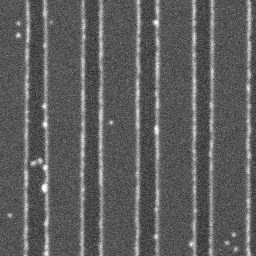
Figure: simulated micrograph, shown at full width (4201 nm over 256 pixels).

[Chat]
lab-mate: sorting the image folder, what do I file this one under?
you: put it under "lines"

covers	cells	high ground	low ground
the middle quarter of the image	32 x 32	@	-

@@@@@----@@@@@@@@@@----@@@@@@@@@
@@@@@----@@@@@@@@@@----@@@@@@@@@
@@@@@----@@@@@@@@@@----@@@@@@@@@
@@@@@----@@@@@@@@@-----@@@@@@@@@
@@@@@----@@@@@@@@@-----@@@@@@@@@
@@@@@----@@@@@@@@@-----@@@@@@@@@
@@@@@----@@@@@@@@@-----@@@@@@@@@
@@@@@----@@@@@@@@@-----@@@@@@@@@
@@@@@----@@@@@@@@@-----@@@@@@@@@
@@@@@----@@@@@@@@@-----@@@@@@@@@
@@@@@----@@@@@@@@@-----@@@@@@@@@
@@@@@----@@@@@@@@@-----@@@@@@@@@
@@@@@----@@@@@@@@@-----@@@@@@@@@
@@@@@----@@@@@@@@@-----@@@@@@@@@
@@@@@----@@@@@@@@@-----@@@@@@@@@
@@@@@----@@@@@@@@@-----@@@@@@@@@
@@@@@----@@@@@@@@@-----@@@@@@@@@
@@@@@----@@@@@@@@@-----@@@@@@@@@
@@@@@----@@@@@@@@@-----@@@@@@@@@
@@@@@----@@@@@@@@@-----@@@@@@@@@
@@@@@----@@@@@@@@@-----@@@@@@@@@
@@@@@----@@@@@@@@@-----@@@@@@@@@
@@@@@----@@@@@@@@@-----@@@@@@@@@
@@@@@----@@@@@@@@@-----@@@@@@@@@
@@@@@----@@@@@@@@@-----@@@@@@@@@
@@@@@----@@@@@@@@@-----@@@@@@@@@
@@@@@----@@@@@@@@@-----@@@@@@@@@
@@@@@----@@@@@@@@@-----@@@@@@@@@
@@@@@----@@@@@@@@@-----@@@@@@@@@
@@@@@----@@@@@@@@@-----@@@@@@@@@
@@@@@----@@@@@@@@@-----@@@@@@@@@
@@@@@----@@@@@@@@@-----@@@@@@@@@